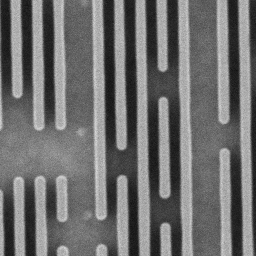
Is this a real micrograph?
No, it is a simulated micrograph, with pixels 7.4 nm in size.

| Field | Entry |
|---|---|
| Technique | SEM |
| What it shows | groups of lines, slits or small figures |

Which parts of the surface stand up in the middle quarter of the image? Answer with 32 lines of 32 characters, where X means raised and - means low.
--------XX---XX---XX----XX---XX-
--------XX---XX---XX----X----XX-
--------XX---XX---XX---------XX-
--------XX---XX---XX---------XX-
--------XX---XX---XX---------XX-
--------XX---XX---XX---------XX-
--------XX---XX----X---------XX-
--------XX---XX----X---------XX-
--------XX---XX----X----X----XX-
--------XX---XX----XX---XX---XX-
--------XX---XX----XX---XX---XX-
--------XX---XX----XX---XX---XX-
--------XX---XX----XX---XX---XX-
--------XX---XX----XX---XX---XX-
--------XX---XX----XX---XX---XX-
--------XX---XX----XX---XX---XX-
--------XX---XX----XX---XX---XXX
--------XX---XX----XX---XX---XXX
--------XX---XX----XX---XX---XXX
--------XX---XX----XX---XX---XXX
--------XX---XX----XX---XX---XXX
--------XX---------XX---XX---XXX
--------XX---------XX---XX---XXX
--------XX---------XX---XX---XXX
--------XX---------XX---XX---XXX
--------XX---------XX---XX---XXX
--------XX---------XX---XX---XXX
--------XX---------XX---XX---XXX
--------XX---XXX---XX---XX---XXX
--------XX---XXX---XX---XX---XXX
--------XX---XXX---XX---XX---XXX
--------XX---XXX---XX---XX---XXX